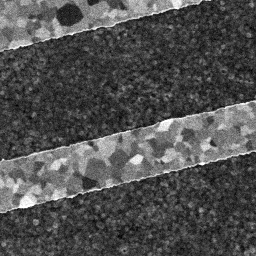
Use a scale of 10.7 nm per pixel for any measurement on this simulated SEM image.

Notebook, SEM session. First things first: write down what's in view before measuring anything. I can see one or a few lines or trenches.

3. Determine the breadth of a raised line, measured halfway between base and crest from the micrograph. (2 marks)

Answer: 522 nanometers